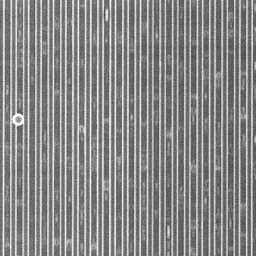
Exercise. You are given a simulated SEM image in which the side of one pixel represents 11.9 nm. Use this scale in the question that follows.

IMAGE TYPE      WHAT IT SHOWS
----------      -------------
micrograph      parallel lines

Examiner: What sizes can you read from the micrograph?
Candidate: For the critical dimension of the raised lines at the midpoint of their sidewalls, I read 74.2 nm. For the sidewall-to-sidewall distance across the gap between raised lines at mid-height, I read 0.0742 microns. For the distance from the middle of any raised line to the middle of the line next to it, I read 147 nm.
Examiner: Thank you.